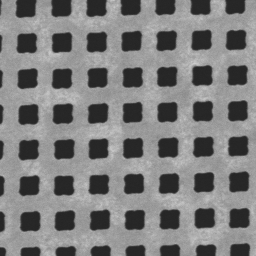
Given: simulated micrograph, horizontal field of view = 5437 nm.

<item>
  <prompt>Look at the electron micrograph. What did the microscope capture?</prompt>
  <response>a regular array of holes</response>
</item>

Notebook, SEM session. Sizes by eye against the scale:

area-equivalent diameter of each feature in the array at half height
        0.467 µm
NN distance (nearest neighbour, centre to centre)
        0.737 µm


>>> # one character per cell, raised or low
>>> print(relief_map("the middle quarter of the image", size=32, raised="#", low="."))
################################
..####.....####.....###.....####
..####.....####.....###.....####
..####.....####.....###.....####
..####.....####.....###.....####
..####.....####....#####....####
################################
################################
################################
##################.######...####
..####.....####.....###.....####
..####.....####.....###.....####
..####.....####.....###.....####
..####.....####.....###.....####
..####....#####....#####...#####
################################
################################
################################
########################....####
...###.....####.....####.....###
...###.....####.....####.....###
...###.....####.....####.....###
...###.....####.....###.....####
..####....#####....#############
################################
################################
################################
################...######...####
..####.....####.....####.....###
..####.....####.....####.....###
...###.....####.....####.....###
...###.....####.....####.....###